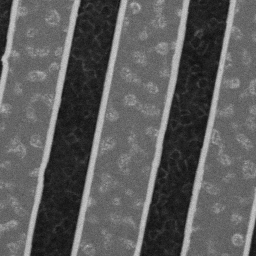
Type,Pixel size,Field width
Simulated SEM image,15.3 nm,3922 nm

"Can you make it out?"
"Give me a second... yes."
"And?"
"one or a few lines or trenches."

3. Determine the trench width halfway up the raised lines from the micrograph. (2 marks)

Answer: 0.71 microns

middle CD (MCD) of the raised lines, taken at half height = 0.94 um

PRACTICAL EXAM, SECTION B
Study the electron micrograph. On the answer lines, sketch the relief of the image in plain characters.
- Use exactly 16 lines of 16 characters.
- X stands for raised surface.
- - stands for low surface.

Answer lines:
-XXXX---XXXX---X
-XXXX--XXXX---XX
-XXX---XXXX---XX
XXXX---XXXX---XX
XXXX---XXXX---XX
XXXX---XXXX---XX
XXXX---XXXX--XXX
XXX---XXXX---XXX
XXX---XXXX---XXX
XXX---XXXX---XXX
XXX---XXXX---XXX
XXX---XXX---XXXX
XX---XXXX---XXXX
XX---XXXX---XXXX
XX---XXXX---XXXX
XX---XXXX---XXX-